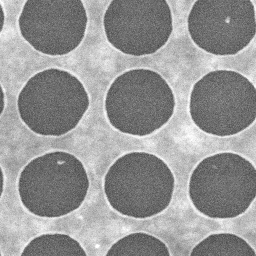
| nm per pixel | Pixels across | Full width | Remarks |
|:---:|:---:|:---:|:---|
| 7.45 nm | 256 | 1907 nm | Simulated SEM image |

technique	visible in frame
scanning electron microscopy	holes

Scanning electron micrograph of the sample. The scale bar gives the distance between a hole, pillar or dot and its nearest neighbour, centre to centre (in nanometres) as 614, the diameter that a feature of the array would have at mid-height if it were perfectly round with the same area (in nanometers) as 510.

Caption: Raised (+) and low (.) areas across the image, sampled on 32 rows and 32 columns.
+++.......++++.......+++........
+++........++........+++........
.+.........++.........+.........
++.........++.........+.........
+++........++........+++........
++++......++++.......+++.......+
+++++....++++++....+++++++....++
++++++++++++++++++++++++++++++++
++++++++++++++++++++++++++++++++
++++.....++++++.....++++++....++
+++.......++++.......+++........
+++........++.........++........
.+.........++.........++........
++.........++.........++........
++........+++........+++........
+++.......++++.......+++.......+
++++....+++++++....+++++++....++
++++++++++++++++++++++++++++++++
++++++++++++++++++++++++++++++++
+++++....++++++....+++++++....++
++++......++++.......++++.......
+++........++........+++........
.+.........++.........++........
++.........++.........++........
++.........++.........++........
+++.......++++.......+++.......+
++++.....++++++.....+++++......+
++++++++++++++++++++++++++++++++
++++++++++++++++++++++++++++++++
+++++....+++++++...+++++++....++
+++.......++++.......++++......+
+++........++........+++........